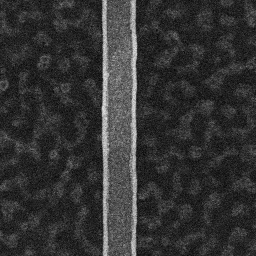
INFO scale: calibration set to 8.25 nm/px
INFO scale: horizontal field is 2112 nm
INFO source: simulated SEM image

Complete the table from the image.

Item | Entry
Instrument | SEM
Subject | one or a few lines or trenches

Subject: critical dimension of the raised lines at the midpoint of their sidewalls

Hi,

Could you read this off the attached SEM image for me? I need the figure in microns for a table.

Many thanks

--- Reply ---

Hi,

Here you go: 0.244